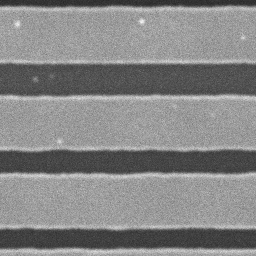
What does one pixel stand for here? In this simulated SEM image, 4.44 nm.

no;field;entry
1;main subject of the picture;lines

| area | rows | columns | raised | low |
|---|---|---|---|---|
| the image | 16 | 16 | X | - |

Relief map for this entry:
XXXXXXXXXXXXXXXX
XXXXXXXXXXXXXXXX
XXXXXXXXXXXXXXXX
XXXXXXXXXXXXXXXX
----------------
----------------
XXXXXXXXXXXXXXXX
XXXXXXXXXXXXXXXX
XXXXXXXXXXXXXXXX
----------------
----------------
XXXXXXXXXXXXXXXX
XXXXXXXXXXXXXXXX
XXXXXXXXXXXXXXXX
----------------
----------------